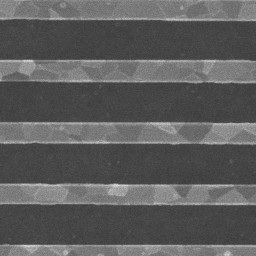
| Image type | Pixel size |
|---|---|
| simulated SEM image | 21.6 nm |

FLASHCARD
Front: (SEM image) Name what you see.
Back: lines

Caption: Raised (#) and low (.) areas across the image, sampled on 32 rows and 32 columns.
################################
################################
.....................###########
................................
................................
................................
................................
................................
################################
################################
................................
................................
................................
................................
................................
################################
################################
################################
................................
................................
................................
................................
................................
################################
################################
......#.....#.##################
................................
................................
................................
................................
................................
################################